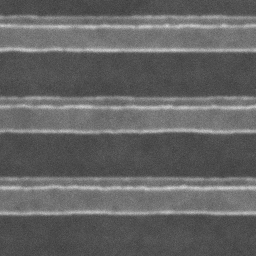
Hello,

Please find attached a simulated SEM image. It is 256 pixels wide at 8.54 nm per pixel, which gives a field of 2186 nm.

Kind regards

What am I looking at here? lines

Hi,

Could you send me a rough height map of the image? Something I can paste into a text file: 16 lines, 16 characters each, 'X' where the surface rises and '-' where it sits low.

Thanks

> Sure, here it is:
----------------
XXXXXXXXXXXXXXXX
XXXXXXXXXXXXXXXX
----------------
----------------
----------------
XXXXXXXXXXXXXXXX
XXXXXXXXXXXXXXXX
----------------
----------------
----------------
XXXXXXXXXXXXXXXX
XXXXXXXXXXXXXXXX
----------------
----------------
----------------